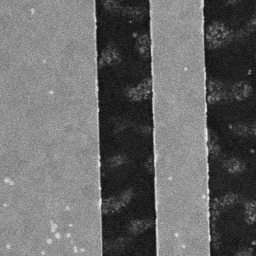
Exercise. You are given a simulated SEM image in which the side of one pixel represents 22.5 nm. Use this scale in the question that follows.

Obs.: one or a few lines or trenches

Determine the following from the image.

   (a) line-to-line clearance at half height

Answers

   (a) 1240 nm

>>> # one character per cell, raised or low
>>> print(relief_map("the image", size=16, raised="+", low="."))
++++++...++++...
++++++...++++...
++++++...++++...
++++++....+++...
++++++....+++...
++++++....+++...
++++++....+++...
++++++....+++...
++++++....+++...
++++++....+++...
++++++....+++...
++++++....+++...
++++++....+++...
++++++....+++...
++++++....+++...
++++++....+++...